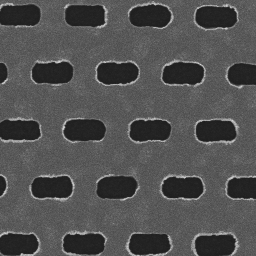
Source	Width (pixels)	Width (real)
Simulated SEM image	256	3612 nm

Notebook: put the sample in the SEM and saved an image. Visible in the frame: a regular array of holes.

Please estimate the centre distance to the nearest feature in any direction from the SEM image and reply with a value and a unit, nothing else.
916 nm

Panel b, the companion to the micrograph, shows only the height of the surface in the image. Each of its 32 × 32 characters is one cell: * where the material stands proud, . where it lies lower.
********************************
.....***.....***.....***.....***
.....***.....***.....***......**
********************************
********************************
********************************
********************************
********************************
.***.....***.....****....****...
.***.....***.....***.....****...
*************.********..*****...
********************************
********************************
********************************
********************************
.....***.....***.....****....***
.....***.....***.....****....***
*********...*****...*****....***
********************************
********************************
********************************
********************************
.***.....****....****....****...
.***.....***.....***.....***....
****.....***....*****....****...
********************************
********************************
********************************
********************************
....****.....****....****....***
.....***.....***.....***.....***
....****.....***.....****....***